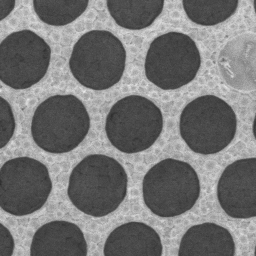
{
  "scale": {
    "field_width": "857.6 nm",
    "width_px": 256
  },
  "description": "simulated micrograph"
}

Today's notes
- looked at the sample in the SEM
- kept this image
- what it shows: holes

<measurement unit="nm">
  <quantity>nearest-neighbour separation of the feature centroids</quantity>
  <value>244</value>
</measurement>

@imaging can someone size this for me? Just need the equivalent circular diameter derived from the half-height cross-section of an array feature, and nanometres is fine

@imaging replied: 195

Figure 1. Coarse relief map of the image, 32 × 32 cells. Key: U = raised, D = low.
DDUUDDDDDDDUUDDDDDDDUUUDDDDDDDUU
DUUUDDDDDDUUUUDDDDDDUUUDDDDDDUUU
UUUUUDDDDUUUUUDDDDDUUUUUDDDDUUUU
UUUUUUUUUUUUUUUUDDUUUUUUUUUUUUUU
UDDDDUUUUUDDDDUUUUUUDDDDUUUUUUUU
DDDDDDUUUDDDDDDUUUUDDDDDUUUUUUUU
DDDDDDUUUDDDDDDDUUDDDDDDDUUUUUUU
DDDDDDUUUDDDDDDDUUDDDDDDDUUUUUUU
DDDDDDUUUDDDDDDDUUDDDDDDDUUUUUUU
DDDDDDUUUDDDDDDUUUDDDDDDUUUUUUUU
UDDDUUUUUUDDDDUUUUUDDDDUUUUUUUUU
UUUUUUUUUUUUUUUUUUUUUUUUUUUUUUUU
DUUUUUDDDDUUUUUDDDDUUUUUDDDDUUUU
DUUUUDDDDDDUUUDDDDDDUUUDDDDDDUUU
DDUUDDDDDDDUUDDDDDDDUUUDDDDDDUUU
DDUUDDDDDDDUUDDDDDDDUUDDDDDDDDUU
DDUUDDDDDDDUUDDDDDDDUUUDDDDDDUUU
DUUUDDDDDDUUUUDDDDDDUUUDDDDDDUUU
UUUUUDDDDUUUUUUDDDDUUUUUDDDDUUUU
UUUUUUUUUUUDDUUUUUUUUUUUUUUUUUUU
UDDDDUUUUUDDDDDUUUUUDDDDUUUUUDDD
DDDDDDUUUDDDDDDDUUDDDDDDUUUUDDDD
DDDDDDUUUDDDDDDDUUDDDDDDDUUDDDDD
DDDDDDUUUDDDDDDDUUDDDDDDDUUDDDDD
DDDDDDUUUDDDDDDDUUDDDDDDDUUDDDDD
DDDDDUUUUDDDDDDUUUDDDDDDUUUUDDDD
UDDDUUUUUUDDDDUUUUUDDDDUUUUUDDDD
UUUUUUUUUUUUUUUUUUUUUUUUUUUUUUUU
DUUUUDDDDDUUUUUDDDDUUUUUDDDDUUUU
DUUUDDDDDDUUUUDDDDDDUUUDDDDDDUUU
DDUUDDDDDDDUUDDDDDDDUUUDDDDDDUUU
DDUUDDDDDDDUUDDDDDDDUUDDDDDDDUUU